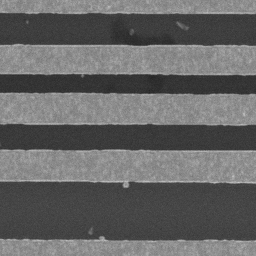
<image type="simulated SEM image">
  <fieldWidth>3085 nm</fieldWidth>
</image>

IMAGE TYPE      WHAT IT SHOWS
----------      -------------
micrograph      lines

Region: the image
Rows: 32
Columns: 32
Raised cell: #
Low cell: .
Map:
################################
################################
................................
................................
................................
................................
################################
################################
################################
................................
................................
................................
################################
################################
################################
#..#############################
................................
................................
................................
################################
################################
################################
################################
................................
................................
................................
................................
................................
................................
................................
################################
################################